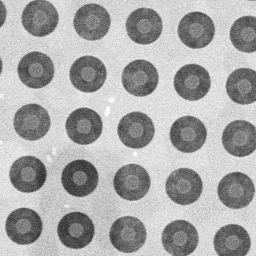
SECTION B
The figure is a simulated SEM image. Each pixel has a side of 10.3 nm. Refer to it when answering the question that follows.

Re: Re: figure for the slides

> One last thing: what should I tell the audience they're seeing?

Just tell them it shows an array of small figures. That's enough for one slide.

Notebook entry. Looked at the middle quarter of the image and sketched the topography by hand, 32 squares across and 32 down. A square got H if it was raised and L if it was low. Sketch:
HHLLLLLLLLHHHHHLLLLLLLLHHHHHHHLL
HLLLLHHLLLLHHHHLLLLLLLLHHHHHLLLL
HLLLHHHHLLLHHHLLLLHHLLLLHHHHLLLL
HLLLLHHLLLLHHHLLLHHHHLLLHHHLLLLH
HHLLLLLLLLHHHHLLLLHHLLLLHHHLLLHH
HHLLLLLLLLHHHHHLLLLLLLLHHHHLLLLH
HHHLLLLLLHHHHHHLLLLLLLLHHHHHLLLL
HHHHHHHHHHHHHHHHLLLLLLHHHHHHLLLL
HHHHHHHHHHHHHHHHHHHHHHHHHHHHHLLL
HHHHHHHHHHHHHHHHHHHHHHHHHHHHHHHH
HHHHHHHHHHHHHHHHHHHHHHHHHHHHHHHH
HHHLLLLHHHHHHHHHHHHHHHHHHHHHHHHH
HLLLLLLLLHHHHHHHLLLLLHHHHHHHHHHH
HLLLLLLLLHHHHHLLLLLLLLHHHHHHHLLL
LLLLHHLLLLHHHHLLLLLLLLHHHHHLLLLL
LLLHHHLLLLHHHLLLLHHLLLLHHHHLLLLL
LLLLHHLLLLHHHLLLHHHHLLLHHHLLLLHH
HLLLLLLLLHHHHLLLLHHLLLLHHHLLLHHH
HLLLLLLLLHHHHHLLLLLLLLHHHHLLLLHH
HHLLLLLLHHHHHHLLLLLLLLHHHHHLLLLL
HHHHHHHHHHHHHHHLLLLLLHHHHHHLLLLL
HHHHHHHHHHHHHHHHHHHHHHHHHHHHLLLL
HHHHHHHHHHHHHHHHHHHHHHHHHHHHHHHH
HHHHHHHHHHHHHHHHHHHHHHHHHHHHHHHH
HHLLLLHHHHHHHHHHHHHHHHHHHHHHHHHH
LLLLLLLLHHHHHHHLLLLLHHHHHHHHHHHH
LLLLLLLLHHHHHLLLLLLLHHHHHHHHLLLL
LLLHHLLLLHHHHLLLLLLLLHHHHHLLLLLL
LLHHHLLLLHHHLLLLHHLLLLHHHHLLLLLL
LLLHHLLLLHHHLLLHHHHLLLHHHLLLLHHL
LLLLLLLLHHHHLLLLHHLLLLHHHLLLHHHH
LLLLLLLLHHHHHLLLLLLLLHHHHLLLLHHL